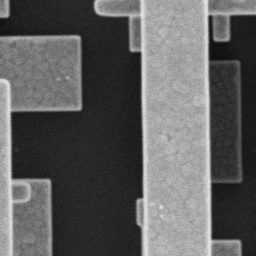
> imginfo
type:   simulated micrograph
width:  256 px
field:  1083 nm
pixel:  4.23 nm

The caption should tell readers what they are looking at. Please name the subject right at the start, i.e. wiring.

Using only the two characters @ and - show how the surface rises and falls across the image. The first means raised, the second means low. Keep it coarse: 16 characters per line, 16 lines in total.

------@@@@@@@@@@
---------@@@@---
---------@@@@---
---------@@@@---
---------@@@@---
@--------@@@@---
@--------@@@@---
@--------@@@@---
@--------@@@@---
@--------@@@@---
@--------@@@@---
@@-------@@@@---
@@-------@@@@---
@--------@@@@---
@--------@@@@---
@--------@@@@---